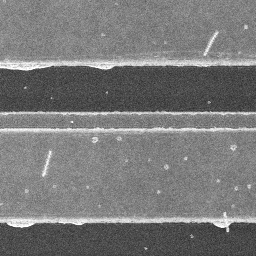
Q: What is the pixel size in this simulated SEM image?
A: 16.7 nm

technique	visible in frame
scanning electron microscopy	lines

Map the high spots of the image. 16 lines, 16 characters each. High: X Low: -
XXXXXXXXXXXXXXXX
XXXXXXXXXXXXXXXX
XXXXXXXXXXXXXXXX
XXXXXXXXXXXXXXXX
----------------
----------------
----------------
XXXXXXXXXXXXXXXX
XXXXXXXXXXXXXXXX
XXXXXXXXXXXXXXXX
XXXXXXXXXXXXXXXX
XXXXXXXXXXXXXXXX
XXXXXXXXXXXXXXXX
XXXXXXXXXXXXXXXX
----------------
----------------